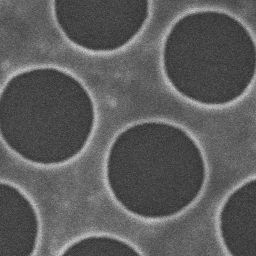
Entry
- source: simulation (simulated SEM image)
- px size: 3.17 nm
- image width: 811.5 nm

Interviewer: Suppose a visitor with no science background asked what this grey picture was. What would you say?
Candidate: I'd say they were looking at holes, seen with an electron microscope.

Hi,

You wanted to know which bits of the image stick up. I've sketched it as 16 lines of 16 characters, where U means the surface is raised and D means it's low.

UUUDDDDDDUUUUUUU
UUUUDDDDDUUDDDDU
UUUUDDDDUUDDDDDD
UUUUUUUUUUDDDDDD
UDDDUUUUUUDDDDDD
DDDDDUUUUUUDDDDU
DDDDDDUUUUUUUDUU
DDDDDDUUUUUUUUUU
DDDDDDUDDDDDUUUU
UDDDDUUDDDDDDUUU
UUUUUUUDDDDDDUUU
UUUUUUUDDDDDDUUD
DDUUUUUDDDDDUUDD
DDUUUUUUUDDUUUDD
DDUUUUUUUUUUUUDD
DDUUDDDDUUUUUUDD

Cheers